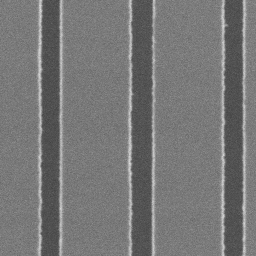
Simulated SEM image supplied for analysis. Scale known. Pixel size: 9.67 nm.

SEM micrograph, lines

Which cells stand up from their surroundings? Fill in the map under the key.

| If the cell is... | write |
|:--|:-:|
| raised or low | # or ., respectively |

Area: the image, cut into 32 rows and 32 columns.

#####...########...#########..##
#####...########...#########..##
#####...########...#########..##
#####...########...#########..##
#####...########...#########..##
#####...########...#########..##
#####...########...#########..##
#####...########...#########..##
#####...########...#########..##
#####...########...#########..##
#####...########...#########..##
#####...########...#########..##
#####...########...#########..##
#####...########...#########..##
#####..#########...#########..##
#####...########...#########..##
#####...########...#########..##
#####...########...#########..##
#####...########...#########..##
#####...########...#########..##
#####...########...#########..##
#####...########...#########..##
#####...########...#########..##
#####...########...#########..##
#####...########...#########..##
#####..#########...#########..##
#####..#########...#########..##
#####...########...#########..##
#####...########...#########..##
#####...########...#########..##
#####..#########...#########..##
#####..#########...#########..##